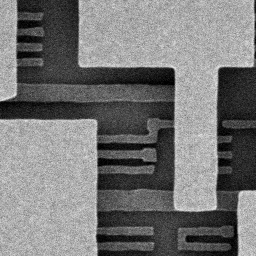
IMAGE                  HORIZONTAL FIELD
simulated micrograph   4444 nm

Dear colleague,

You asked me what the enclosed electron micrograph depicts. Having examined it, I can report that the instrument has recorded wiring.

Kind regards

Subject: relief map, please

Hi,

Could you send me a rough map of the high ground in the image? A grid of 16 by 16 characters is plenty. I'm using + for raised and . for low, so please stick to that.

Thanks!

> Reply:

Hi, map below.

+....+++++++++++
+....+++++++++++
+....+++++++++++
+....+++++++++++
+..........+++..
+..........+++..
...........+++..
...........+++..
++++++.....+++..
++++++.....+++..
++++++.....+++..
++++++.....+++..
++++++.....++..+
++++++.........+
++++++.........+
++++++.........+